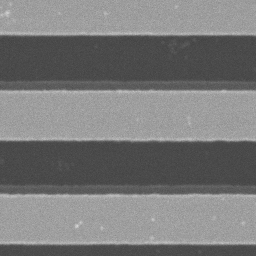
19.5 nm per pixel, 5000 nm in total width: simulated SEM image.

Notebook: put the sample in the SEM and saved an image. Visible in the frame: lines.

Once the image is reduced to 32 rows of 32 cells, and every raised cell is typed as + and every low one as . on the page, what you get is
++++++++++++++++++++++++++++++++
++++++++++++++++++++++++++++++++
++++++++++++++++++++++++++++++++
++++++++++++++++++++++++++++++++
................................
................................
................................
................................
................................
................................
................................
++++++++++++++++++++++++++++++++
++++++++++++++++++++++++++++++++
++++++++++++++++++++++++++++++++
++++++++++++++++++++++++++++++++
++++++++++++++++++++++++++++++++
++++++++++++++++++++++++++++++++
++++.+..+++...+++++++++++++.++++
................................
................................
................................
................................
................................
................................
++++++++++++++++++++++++++++++++
++++++++++++++++++++++++++++++++
++++++++++++++++++++++++++++++++
++++++++++++++++++++++++++++++++
++++++++++++++++++++++++++++++++
++++++++++++++++++++++++++++++++
................................
................................